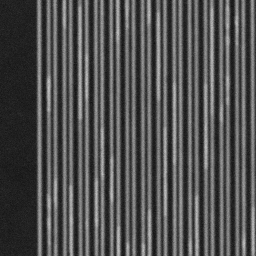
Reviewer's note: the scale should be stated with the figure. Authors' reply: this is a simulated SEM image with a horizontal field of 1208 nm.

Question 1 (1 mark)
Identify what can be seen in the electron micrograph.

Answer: parallel lines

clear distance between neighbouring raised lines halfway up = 27.1 nm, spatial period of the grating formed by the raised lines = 37.3 nm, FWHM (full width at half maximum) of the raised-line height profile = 13.6 nm